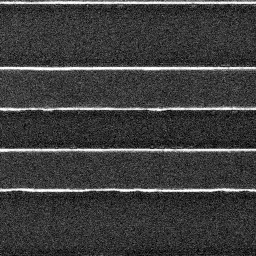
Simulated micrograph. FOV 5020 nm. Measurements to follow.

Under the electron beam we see lines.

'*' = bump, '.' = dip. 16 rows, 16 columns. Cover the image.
................
................
................
................
****************
****************
****************
................
................
****************
****************
****************
................
................
................
................